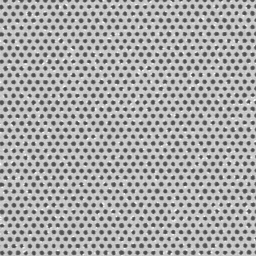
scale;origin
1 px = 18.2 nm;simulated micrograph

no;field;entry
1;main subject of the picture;a regular array of holes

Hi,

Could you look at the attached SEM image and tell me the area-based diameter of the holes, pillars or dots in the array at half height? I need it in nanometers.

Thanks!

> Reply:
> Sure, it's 84.6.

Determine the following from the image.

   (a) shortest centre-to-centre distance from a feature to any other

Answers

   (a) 139 nm